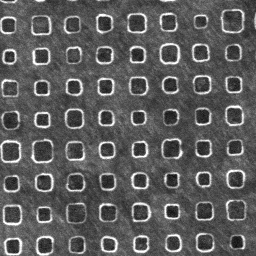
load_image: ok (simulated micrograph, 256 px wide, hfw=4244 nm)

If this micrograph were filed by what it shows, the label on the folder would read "a regular array of holes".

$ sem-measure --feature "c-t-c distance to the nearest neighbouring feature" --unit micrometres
0.519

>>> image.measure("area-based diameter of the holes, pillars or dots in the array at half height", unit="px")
15.7